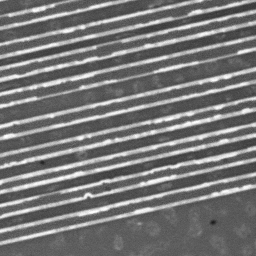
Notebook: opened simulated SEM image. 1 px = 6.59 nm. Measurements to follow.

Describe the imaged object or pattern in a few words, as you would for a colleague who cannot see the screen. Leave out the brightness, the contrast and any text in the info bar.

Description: parallel lines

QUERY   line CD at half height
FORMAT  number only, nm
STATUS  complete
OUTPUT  94.9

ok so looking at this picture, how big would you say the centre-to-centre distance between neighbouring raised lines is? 0.172 um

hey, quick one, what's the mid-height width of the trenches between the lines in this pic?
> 76.4 nm